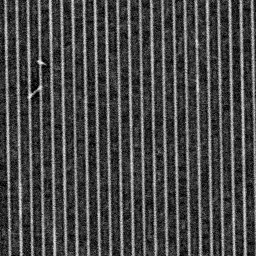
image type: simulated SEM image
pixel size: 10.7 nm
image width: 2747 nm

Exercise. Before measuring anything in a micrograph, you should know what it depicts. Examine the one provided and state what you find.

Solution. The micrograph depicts parallel lines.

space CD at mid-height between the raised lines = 97.9 nm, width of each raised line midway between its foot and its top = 20.1 nanometers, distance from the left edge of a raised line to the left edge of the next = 120 nanometres